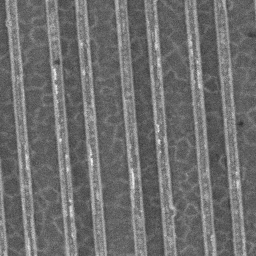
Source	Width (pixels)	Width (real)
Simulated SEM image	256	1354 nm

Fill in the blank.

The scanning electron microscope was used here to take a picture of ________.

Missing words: parallel lines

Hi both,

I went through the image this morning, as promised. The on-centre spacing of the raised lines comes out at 183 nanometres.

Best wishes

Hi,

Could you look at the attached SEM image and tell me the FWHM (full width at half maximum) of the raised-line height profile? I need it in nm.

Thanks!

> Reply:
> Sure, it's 51.3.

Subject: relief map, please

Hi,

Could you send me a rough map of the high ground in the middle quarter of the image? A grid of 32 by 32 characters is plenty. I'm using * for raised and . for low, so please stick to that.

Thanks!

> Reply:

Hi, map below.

....**........***.....**........
.....**.......***.....**........
.....**.......***.....**........
.....**.......***.....**........
.....**........**.....**........
.....**........**.....**........
.....**........**.....***.......
.....**........**.....***.......
.....**........**.....***.......
.....**........**.....***.......
.....***.......***....***.......
.....***.......***.....**.......
.....***.......***.....**.......
......**.......***.....**.......
......**.......***.....**.......
......**.......***.....**.......
......**........**.....**.......
*.....**........**.....**.......
*.....**........**.....***......
*.....**........**.....***......
*.....**........**.....***......
*.....**........**......**......
*.....**........***.....**......
*.....**........***.....**......
*.....**........***.....**......
*.....***........**.....**......
*.....***........**.....**......
*.....***.......***.....**......
*......**........**.....**......
**.....**........**.....**......
**.....**........**.....***.....
**.....**........**.....***.....